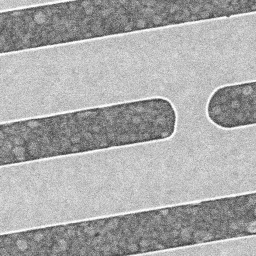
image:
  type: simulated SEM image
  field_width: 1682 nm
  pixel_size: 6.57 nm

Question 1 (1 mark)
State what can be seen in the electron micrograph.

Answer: one or a few lines or trenches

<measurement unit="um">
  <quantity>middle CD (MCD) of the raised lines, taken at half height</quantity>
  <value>0.447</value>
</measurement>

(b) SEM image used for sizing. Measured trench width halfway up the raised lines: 278 nm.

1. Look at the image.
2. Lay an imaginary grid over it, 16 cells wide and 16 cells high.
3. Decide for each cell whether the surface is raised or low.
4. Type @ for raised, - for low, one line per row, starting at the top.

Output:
@---------------
-----------@@@@@
-----@@@@@@@@@@@
@@@@@@@@@@@@@@@@
@@@@@@@@@@@@@@@@
@@@@@@@@@@@@@@--
@@@@@@@----@@---
@----------@@---
-----------@@@@@
------@@@@@@@@@@
@@@@@@@@@@@@@@@@
@@@@@@@@@@@@@@@@
@@@@@@@@@@@@@---
@@@@@@@---------
@---------------
-----------@@@@@